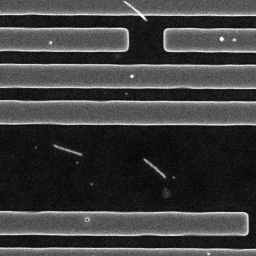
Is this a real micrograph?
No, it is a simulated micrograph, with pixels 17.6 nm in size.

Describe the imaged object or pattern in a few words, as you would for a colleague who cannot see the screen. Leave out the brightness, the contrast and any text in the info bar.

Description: groups of lines, slits or small figures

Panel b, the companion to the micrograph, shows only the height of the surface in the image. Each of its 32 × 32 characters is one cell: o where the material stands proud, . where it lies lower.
oooooooooooooooooooooooooooooooo
oooooooooooooooooooooooooooooooo
................................
................................
oooooooooooooooo.....ooooooooooo
oooooooooooooooo.....ooooooooooo
................................
................................
oooooooooooooooooooooooooooooooo
oooooooooooooooooooooooooooooooo
oooooooooooooooooooooooooooooooo
................................
................................
oooooooooooooooooooooooooooooooo
oooooooooooooooooooooooooooooooo
.......ooooooooooooooooooooooooo
................................
................................
................................
................................
................................
................................
................................
................................
................................
................................
oo..............................
ooooooooooooooooooooooooooooooo.
ooooooooooooooooooooooooooooooo.
................................
................................
oooooooooooooooooooooooooooooooo